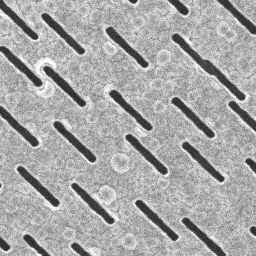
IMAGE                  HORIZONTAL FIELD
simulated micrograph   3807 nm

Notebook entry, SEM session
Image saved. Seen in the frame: a regular array of holes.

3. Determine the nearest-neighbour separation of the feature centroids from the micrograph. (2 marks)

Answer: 773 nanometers